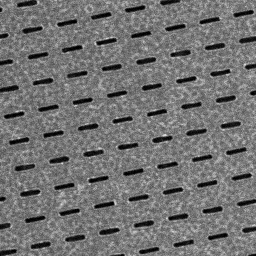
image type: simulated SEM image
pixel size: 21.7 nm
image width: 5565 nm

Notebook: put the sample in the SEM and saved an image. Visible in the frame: a regular array of holes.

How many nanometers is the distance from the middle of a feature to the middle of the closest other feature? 574